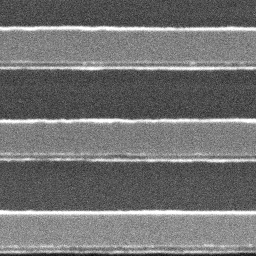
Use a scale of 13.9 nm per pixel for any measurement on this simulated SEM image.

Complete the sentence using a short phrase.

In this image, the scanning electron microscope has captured lines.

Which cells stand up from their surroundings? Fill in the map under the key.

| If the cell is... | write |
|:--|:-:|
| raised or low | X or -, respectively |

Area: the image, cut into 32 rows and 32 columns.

--------------------------------
--------------------------------
--------------------------------
--------------------------------
XXXXXXXXXXXXXXXXXXXXXXXXXXXXXXXX
XXXXXXXXXXXXXXXXXXXXXXXXXXXXXXXX
XXXXXXXXXXXXXXXXXXXXXXXXXXXXXXXX
XXXXXXXXXXXXXXXXXXXXXXXXXXXXXXXX
-------X-X-XX----XXXXX-XX-XXXXXX
--------------------------------
--------------------------------
--------------------------------
--------------------------------
--------------------------------
--------------------------------
XXXXXXXXXXXXXXXXXXXXXXXXXXXXXXXX
XXXXXXXXXXXXXXXXXXXXXXXXXXXXXXXX
XXXXXXXXXXXXXXXXXXXXXXXXXXXXXXXX
XXXXXXXXXXXXXXXXXXXXXXXXXXXXXXXX
XXXXXXXXXXXXXXXXXXXXXXXXXXXXXXXX
--------------------------------
--------------------------------
--------------------------------
--------------------------------
--------------------------------
--------------------------------
X--X-------X------XX-------XXX--
XXXXXXXXXXXXXXXXXXXXXXXXXXXXXXXX
XXXXXXXXXXXXXXXXXXXXXXXXXXXXXXXX
XXXXXXXXXXXXXXXXXXXXXXXXXXXXXXXX
XXXXXXXXXXXXXXXXXXXXXXXXXXXXXXXX
--------------------------------